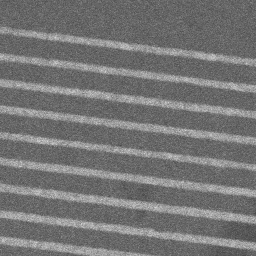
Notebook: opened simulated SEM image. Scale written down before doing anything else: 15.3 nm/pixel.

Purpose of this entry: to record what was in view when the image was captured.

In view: parallel lines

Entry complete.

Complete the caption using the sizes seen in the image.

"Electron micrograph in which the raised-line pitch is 398 nanometers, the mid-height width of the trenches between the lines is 298 nanometres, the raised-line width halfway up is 101 nm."